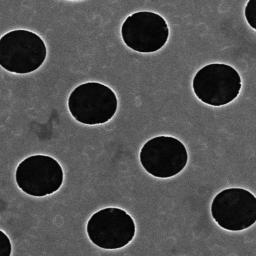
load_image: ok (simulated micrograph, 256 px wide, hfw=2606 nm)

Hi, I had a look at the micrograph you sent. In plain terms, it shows holes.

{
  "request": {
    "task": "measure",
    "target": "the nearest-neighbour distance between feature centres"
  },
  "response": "905 nanometres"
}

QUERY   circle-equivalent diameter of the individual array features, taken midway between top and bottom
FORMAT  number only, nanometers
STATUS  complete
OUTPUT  450